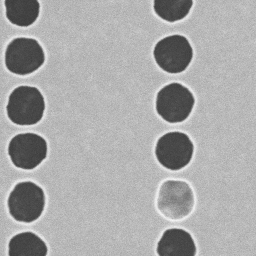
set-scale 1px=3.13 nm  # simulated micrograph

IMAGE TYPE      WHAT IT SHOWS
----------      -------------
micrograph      holes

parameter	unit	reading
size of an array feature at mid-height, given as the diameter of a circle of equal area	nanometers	122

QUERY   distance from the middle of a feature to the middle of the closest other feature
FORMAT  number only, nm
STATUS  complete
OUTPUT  149